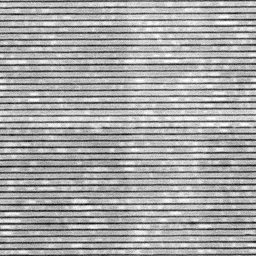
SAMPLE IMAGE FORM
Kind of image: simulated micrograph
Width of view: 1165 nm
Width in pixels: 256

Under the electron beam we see parallel lines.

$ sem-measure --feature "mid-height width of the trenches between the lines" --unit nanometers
8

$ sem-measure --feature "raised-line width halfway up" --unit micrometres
0.0199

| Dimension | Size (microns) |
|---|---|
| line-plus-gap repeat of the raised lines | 0.0289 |